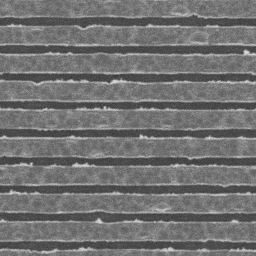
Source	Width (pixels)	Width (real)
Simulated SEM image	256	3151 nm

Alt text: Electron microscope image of parallel lines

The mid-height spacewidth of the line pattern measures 8.38 pixels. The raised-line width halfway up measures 238 nanometers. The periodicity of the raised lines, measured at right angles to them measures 27.9 pixels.